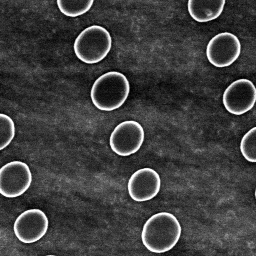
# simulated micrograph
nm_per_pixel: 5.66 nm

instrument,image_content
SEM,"raised bodies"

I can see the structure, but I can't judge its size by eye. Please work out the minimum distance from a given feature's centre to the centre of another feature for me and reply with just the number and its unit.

282 nanometers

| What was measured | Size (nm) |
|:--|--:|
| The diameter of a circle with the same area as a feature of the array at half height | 186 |